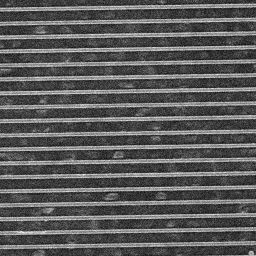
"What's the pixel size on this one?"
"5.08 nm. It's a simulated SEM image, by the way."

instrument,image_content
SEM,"parallel lines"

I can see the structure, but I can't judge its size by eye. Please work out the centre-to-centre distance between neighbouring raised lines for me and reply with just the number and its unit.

70.9 nm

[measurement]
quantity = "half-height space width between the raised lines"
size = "55.8 nm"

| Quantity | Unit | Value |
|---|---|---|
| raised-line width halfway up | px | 3.13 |